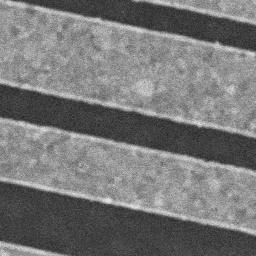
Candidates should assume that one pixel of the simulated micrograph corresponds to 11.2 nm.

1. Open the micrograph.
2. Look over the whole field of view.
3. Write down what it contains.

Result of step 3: one or a few lines or trenches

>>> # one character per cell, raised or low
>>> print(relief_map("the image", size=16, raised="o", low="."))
oo..........oooo
ooooooo.........
oooooooooooo....
oooooooooooooooo
oooooooooooooooo
..oooooooooooooo
.......ooooooooo
............oooo
ooooo...........
oooooooooo......
oooooooooooooo..
..oooooooooooooo
......oooooooooo
...........ooooo
................
o...............